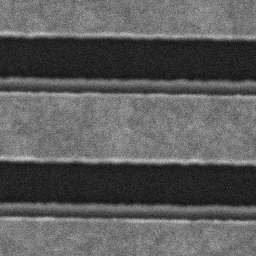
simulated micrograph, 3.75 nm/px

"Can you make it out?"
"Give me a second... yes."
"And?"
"lines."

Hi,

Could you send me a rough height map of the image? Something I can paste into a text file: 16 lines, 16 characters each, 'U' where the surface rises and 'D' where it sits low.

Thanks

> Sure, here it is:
UUUUUUUUUUUUUUUU
UUUUUUUUUUUUUUUU
DDDDDDDDDDDDDDDD
DDDDDDDDDDDDDDDD
DDDDDDDDDDDDDDDD
DDDDDDDDDDDDDDDD
UUUUUUUUUUUUUUUU
UUUUUUUUUUUUUUUU
UUUUUUUUUUUUUUUU
UUUUUUUUUUUUUUUU
DDDDDDDDDDDDDDDD
DDDDDDDDDDDDDDDD
DDDDDDDDDDDDDDDD
DDDDDDDDDDDDDDDD
UUUUUUUUUUUUUUUU
UUUUUUUUUUUUUUUU